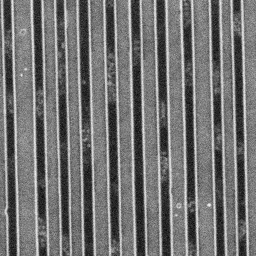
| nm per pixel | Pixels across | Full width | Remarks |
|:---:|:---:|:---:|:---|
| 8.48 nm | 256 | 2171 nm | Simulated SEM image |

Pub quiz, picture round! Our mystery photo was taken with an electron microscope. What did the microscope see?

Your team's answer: parallel lines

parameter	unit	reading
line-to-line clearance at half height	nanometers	117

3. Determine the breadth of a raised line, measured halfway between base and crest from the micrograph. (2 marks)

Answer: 0.0954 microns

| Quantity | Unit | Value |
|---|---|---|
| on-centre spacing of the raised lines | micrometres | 0.216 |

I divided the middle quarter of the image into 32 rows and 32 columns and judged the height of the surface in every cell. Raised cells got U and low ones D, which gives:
UDDDUUDDDDUUUDDDDUUDDDDUUUDDDDUU
UDDDUUUDDDUUUDDDDUUDDDDUUUDDDDUU
UDDDUUUDDDUUUDDDDUUDDDDUUUDDDDUU
UDDDUUUDDDUUUDDDDUUDDDDUUUDDDDUU
UDDDUUUDDDDUUDDDDUUDDDDUUUDDDDUU
UDDDUUUDDDDUUDDDDUUUDDDUUUDDDDUU
UDDDUUUDDDDUUDDDDUUUDDDUUUDDDDUU
UDDDUUUDDDDUUDDDDUUUDDDUUUDDDDUU
UDDDUUUDDDDUUDDDDUUUDDDUUUDDDDUU
UDDDUUUDDDDUUDDDDUUUDDDUUUDDDDUU
UDDDUUUDDDDUUDDDDUUUDDDDUUDDDDUU
UDDDUUUDDDDUUDDDDUUUDDDDUUDDDDUU
UDDDUUUDDDDUUDDDDUUUDDDDUUDDDDUU
UDDDUUUDDDDUUDDDDUUUDDDDUUDDDDUU
UDDDUUUDDDDUUDDDDUUUDDDDUUDDDDUU
UDDDUUUDDDDUUUDDDUUUDDDDUUDDDDUU
UDDDUUUDDDDUUUDDDUUUDDDDUUDDDDUU
UDDDUUUDDDDUUUDDDUUUDDDDUUDDDDUU
UDDDUUUDDDDUUUDDDUUUDDDDUUDDDDUU
UDDDUUUDDDDUUUDDDUUUDDDDUUDDDDUU
UDDDUUUDDDDUUUDDDUUUDDDDUUDDDDUU
UDDDUUUDDDDUUUDDDUUUDDDDUUDDDDUU
UDDDUUUDDDDUUUDDDUUUDDDDUUDDDDUU
UDDDUUUDDDDUUUDDDUUUDDDDUUDDDDUU
UDDDUUUDDDDUUUDDDUUUDDDDUUDDDDUU
UDDDDUUDDDDUUUDDDUUUDDDDUUDDDDUU
UDDDDUUDDDDUUUDDDUUUDDDDUUDDDDUU
UDDDDUUDDDDUUUDDDUUUDDDDUUDDDDUU
UDDDDUUDDDDUUUDDDUUUDDDDUUDDDDUU
UDDDDUUDDDDUUUDDDDUUDDDDUUUDDDUU
UDDDDUUDDDDUUUDDDDUUDDDDUUUDDDUU
UDDDDUUDDDDUUUDDDDUUDDDDUUUDDDUU